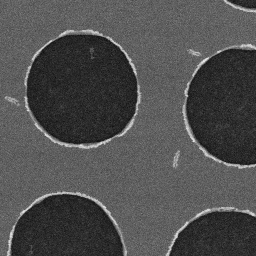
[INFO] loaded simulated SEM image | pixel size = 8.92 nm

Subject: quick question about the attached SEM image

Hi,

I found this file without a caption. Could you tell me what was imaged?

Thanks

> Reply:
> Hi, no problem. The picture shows holes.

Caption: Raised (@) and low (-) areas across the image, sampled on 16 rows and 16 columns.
@@@@@@@@@@@@@@@-
@@@@@@@@@@@@@@@@
@@@----@@@@@@@@@
@@------@@@@@---
@@------@@@@----
@@-------@@@----
@@-------@@@----
@@------@@@@----
@@@----@@@@@----
@@@@@@@@@@@@@---
@@@@@@@@@@@@@@@@
@@@@@@@@@@@@@@@@
@@@---@@@@@@@@@@
@------@@@@@@---
@------@@@@-----
@-------@@@-----